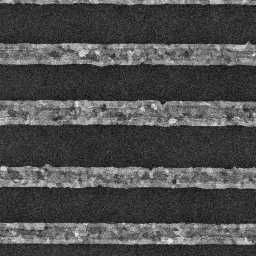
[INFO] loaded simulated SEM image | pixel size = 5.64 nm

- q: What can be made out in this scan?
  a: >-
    one or a few lines or trenches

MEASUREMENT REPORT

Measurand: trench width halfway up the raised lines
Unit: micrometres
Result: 0.241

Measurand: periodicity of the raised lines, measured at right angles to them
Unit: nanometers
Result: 337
